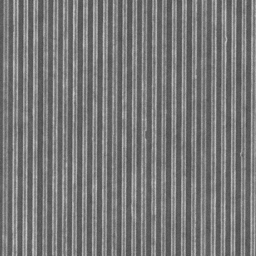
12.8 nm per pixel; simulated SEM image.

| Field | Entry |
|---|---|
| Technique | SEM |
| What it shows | parallel lines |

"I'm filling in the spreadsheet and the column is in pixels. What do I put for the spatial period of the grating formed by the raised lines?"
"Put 9.91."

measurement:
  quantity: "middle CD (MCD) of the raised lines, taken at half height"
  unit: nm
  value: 48.1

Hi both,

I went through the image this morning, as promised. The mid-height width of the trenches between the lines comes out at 0.0818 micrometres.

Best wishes